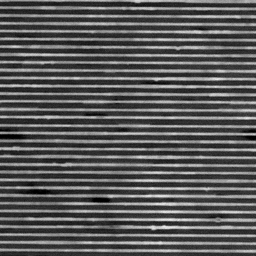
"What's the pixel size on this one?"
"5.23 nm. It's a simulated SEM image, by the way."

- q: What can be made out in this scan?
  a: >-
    parallel lines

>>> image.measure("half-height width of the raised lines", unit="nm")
10.5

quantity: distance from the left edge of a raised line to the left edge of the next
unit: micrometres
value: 0.0409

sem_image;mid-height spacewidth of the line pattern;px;4.99